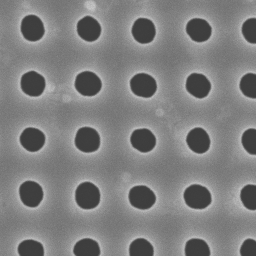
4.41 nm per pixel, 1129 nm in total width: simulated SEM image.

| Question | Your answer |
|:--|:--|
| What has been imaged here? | a regular array of holes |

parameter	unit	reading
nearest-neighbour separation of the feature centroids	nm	241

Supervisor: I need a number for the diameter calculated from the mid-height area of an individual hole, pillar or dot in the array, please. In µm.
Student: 0.112